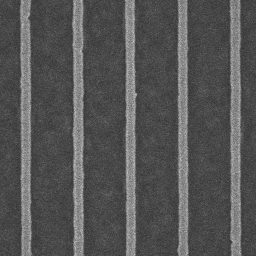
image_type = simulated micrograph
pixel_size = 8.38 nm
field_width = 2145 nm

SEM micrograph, parallel lines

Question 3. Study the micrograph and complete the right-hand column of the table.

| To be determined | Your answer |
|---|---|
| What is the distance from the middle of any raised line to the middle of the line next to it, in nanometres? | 439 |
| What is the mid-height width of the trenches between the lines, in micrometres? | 0.366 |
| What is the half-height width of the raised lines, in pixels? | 8.11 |